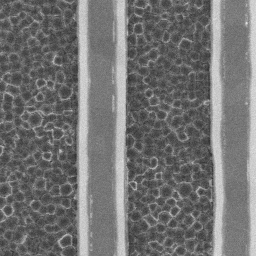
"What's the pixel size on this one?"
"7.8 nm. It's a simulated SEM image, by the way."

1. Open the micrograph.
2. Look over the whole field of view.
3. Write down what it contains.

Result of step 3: one or a few lines or trenches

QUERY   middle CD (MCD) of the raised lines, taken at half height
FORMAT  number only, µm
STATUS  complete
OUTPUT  0.298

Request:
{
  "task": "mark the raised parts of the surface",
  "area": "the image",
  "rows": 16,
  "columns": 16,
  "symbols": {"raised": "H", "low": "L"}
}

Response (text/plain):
LLLLLHHHLLLLLHHH
LLLLLHHHLLLLLHHH
LLLLLHHHLLLLLHHH
LLLLLHHHLLLLLHHH
LLLLLHHHLLLLLHHH
LLLLLHHHLLLLLLHH
LLLLLHHHLLLLLLHH
LLLLLHHHLLLLLLHH
LLLLLHHHLLLLLHHH
LLLLLHHHLLLLLLHH
LLLLLHHHLLLLLLHH
LLLLLHHHLLLLLLHH
LLLLLHHHLLLLLLHH
LLLLLHHHLLLLLLHH
LLLLLHHHLLLLLLHH
LLLLLHHHLLLLLLHH